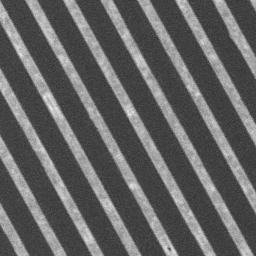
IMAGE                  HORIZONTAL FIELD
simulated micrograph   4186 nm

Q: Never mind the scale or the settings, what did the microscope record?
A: parallel lines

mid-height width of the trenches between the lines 388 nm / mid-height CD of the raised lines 0.152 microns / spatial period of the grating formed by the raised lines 0.535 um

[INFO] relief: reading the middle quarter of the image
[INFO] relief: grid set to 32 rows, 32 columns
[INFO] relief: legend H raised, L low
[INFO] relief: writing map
HHLLLLLLLHHHLLLLLLLHHLLLLLLLHHLL
HHHLLLLLLLHHLLLLLLLHHLLLLLLLHHHL
LHHLLLLLLLHHHLLLLLLLHHLLLLLLLHHL
LHHHLLLLLLLHHLLLLLLLHHHLLLLLLHHH
LLHHLLLLLLLHHHLLLLLLLHHLLLLLLLHH
LLHHHLLLLLLLHHLLLLLLLHHHLLLLLLLH
LLLHHLLLLLLLHHHLLLLLLLHHLLLLLLLH
LLLLHHLLLLLLLHHHLLLLLLHHHLLLLLLL
LLLLHHHLLLLLLLHHLLLLLLLHHLLLLLLL
LLLLLHHLLLLLLLHHHLLLLLLLHHLLLLLL
LLLLLHHHLLLLLLLHHLLLLLLLHHLLLLLL
LLLLLLHHLLLLLLLHLHLLLLLLLHHLLLLL
LLLLLLHHHLLLLLLLLHLLLLLLLHHHLLLL
LLLLLLLHHLLLLLLLHHHLLLLLLLHHLLLL
HLLLLLLHHHLLLLLLLHHLLLLLLLHHHLLL
HLLLLLLLHHHLLLLLLHHHLLLLLLLHHLLL
HHLLLLLLLHHLLLLLLLHHLLLLLLLHHHLL
HHLLLLLLLHHHLLLLLLLHHLLLLLLLHHLL
HHHLLLLLLLHHLLLLLLLHHHLLLLLLHHHL
LHHLLLLLLLHHHLLLLLLLHHLLLLLLLHHL
LLHHLLLLLLLHHLLLLLLLHHHLLLLLLHHH
LLHHLLLLLLLHHHLLLLLLLHHLLLLLLLHH
LLLHHLLLLLLLHHLLLLLLLHHHLLLLLLLH
LLLHHHLLLLLLHHHLLLLLLLHHLLLLLLLH
LLLLHHLLLLLLLHHLLLLLLLHHHLLLLLLL
LLLLHHHLLLLLLLHHLLLLLLLHHHLLLLLL
LLLLLHHLLLLLLLHHLLLLLLLLHHLLLLLL
LLLLLHHHLLLLLLLHHLLLLLLLHHHLLLLL
LLLLLLHHLLLLLLLHHHLLLLLLLHHLLLLL
LLLLLLHHHLLLLLLLHHLLLLLLLHHHLLLL
LLLLLLLHHLLLLLLLHHHLLLLLLLHHLLLL
HLLLLLLHHHLLLLLLLHHLLLLLLLHHHLLL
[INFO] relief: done